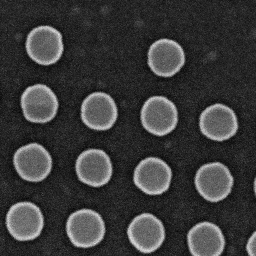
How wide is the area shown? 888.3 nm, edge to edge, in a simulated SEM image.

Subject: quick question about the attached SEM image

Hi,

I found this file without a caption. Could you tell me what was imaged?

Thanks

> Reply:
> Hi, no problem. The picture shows a regular array of raised bodies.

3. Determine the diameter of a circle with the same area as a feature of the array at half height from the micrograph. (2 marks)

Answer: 0.124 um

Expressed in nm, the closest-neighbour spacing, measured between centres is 204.